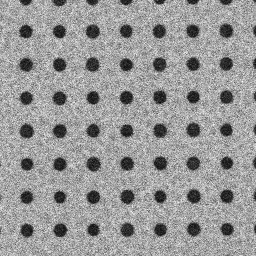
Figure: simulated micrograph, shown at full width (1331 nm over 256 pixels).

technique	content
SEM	a regular array of holes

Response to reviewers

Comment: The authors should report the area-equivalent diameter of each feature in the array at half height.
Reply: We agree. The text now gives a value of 68.5 nanometers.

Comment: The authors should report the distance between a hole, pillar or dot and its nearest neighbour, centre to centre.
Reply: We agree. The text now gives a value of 171 nm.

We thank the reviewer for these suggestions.